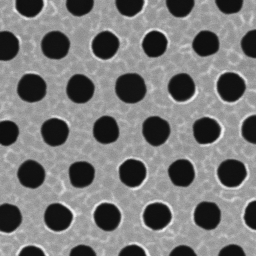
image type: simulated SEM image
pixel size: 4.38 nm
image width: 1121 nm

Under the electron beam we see a regular array of holes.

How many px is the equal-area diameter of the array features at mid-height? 27.2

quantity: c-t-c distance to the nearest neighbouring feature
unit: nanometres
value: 214